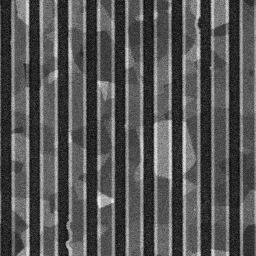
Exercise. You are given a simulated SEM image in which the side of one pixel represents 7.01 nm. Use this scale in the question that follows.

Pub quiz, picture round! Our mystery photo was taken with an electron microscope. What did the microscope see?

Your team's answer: parallel lines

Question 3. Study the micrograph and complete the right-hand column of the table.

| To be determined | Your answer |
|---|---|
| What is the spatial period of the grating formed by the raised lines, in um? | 0.2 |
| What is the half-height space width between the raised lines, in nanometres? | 102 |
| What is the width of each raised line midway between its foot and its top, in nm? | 102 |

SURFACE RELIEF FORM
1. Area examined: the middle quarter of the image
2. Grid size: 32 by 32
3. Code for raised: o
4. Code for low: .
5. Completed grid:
..ooo....ooo....ooo....ooo....oo
..ooo....ooo....ooo....ooo....oo
..ooo....ooo....ooo....ooo....oo
..ooo....ooo....ooo....ooo....oo
..ooo....ooo....ooo....ooo....oo
..ooo....ooo....ooo....ooo....oo
..ooo....ooo....ooo....ooo....oo
..ooo....ooo....ooo....ooo....oo
..ooo....ooo....ooo....ooo....oo
..ooo....ooo....ooo....ooo....oo
..ooo....ooo....ooo....ooo....oo
..ooo....ooo....ooo....ooo....oo
..ooo....ooo....ooo....ooo....oo
..ooo....ooo....ooo....ooo....oo
..ooo....ooo....ooo....ooo....oo
..ooo....ooo....ooo....ooo....oo
..ooo....ooo....ooo....ooo....oo
..ooo....ooo....ooo....ooo....oo
..ooo....ooo....ooo....ooo....oo
..ooo....ooo....ooo....ooo....oo
..ooo....ooo....ooo....ooo....oo
..ooo....ooo....ooo....ooo....oo
..ooo....ooo....ooo....ooo....oo
..ooo....ooo....ooo....ooo....oo
..ooo....ooo....ooo....ooo....oo
..ooo....ooo....ooo....ooo....oo
..ooo....ooo....ooo....ooo....oo
..ooo....ooo....ooo....ooo....oo
..ooo....ooo....ooo....ooo....oo
..ooo....ooo....ooo....oooo...oo
..ooo....ooo....ooo....oooo...oo
..ooo....ooo....ooo....oooo...oo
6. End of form